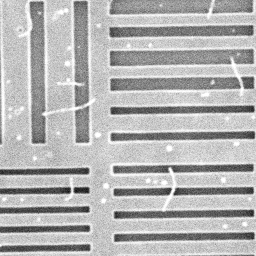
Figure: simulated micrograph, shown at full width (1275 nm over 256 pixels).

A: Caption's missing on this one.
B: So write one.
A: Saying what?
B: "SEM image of groups of lines, slits or small figures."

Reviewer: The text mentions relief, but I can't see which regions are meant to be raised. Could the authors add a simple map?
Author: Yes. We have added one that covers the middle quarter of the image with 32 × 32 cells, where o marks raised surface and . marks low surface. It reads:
oo....oooooo...........ooooooooo
oo....oooooooooooooooooooooooooo
oo....oooooooooooooooooooooooooo
oo.....ooooo....................
ooo....oooo.....................
ooo....oooo.....................
oo.....ooooo....................
oo.....ooooooooooooooooooooooooo
oo.....ooooooooooooooooooooooooo
oo....oooooooooooooooooooooooooo
oo....oooooooooooooooooo........
ooo....oooo.....................
ooo....ooooo....................
ooo....ooooooooooooooooooooooooo
ooo....ooooooooooooooooooooooooo
ooo....ooooooooooooooooooooooooo
ooo....ooooooooooooooooooooooooo
ooo....ooooo....................
ooo....oooo.....................
ooo....ooooo.....ooooooooooooooo
oooooooooooooooooooooooooooooooo
oooooooooooooooooooooooooooooooo
oooooooooooooooooooooooooooooooo
oooooooooooooooooooooooooooooooo
oooooooooooooooooooooooooooooooo
oooooooooooo....................
.......ooooo....................
......ooooooo......ooooooooooooo
oooooooooooooooooooooooooooooooo
oooooooooooooooooooooooooooooooo
oooooooooooooooooooooooooooooooo
.......ooooo...............o....